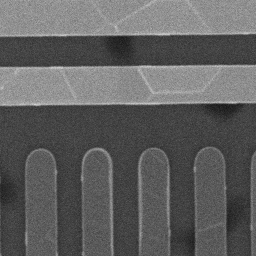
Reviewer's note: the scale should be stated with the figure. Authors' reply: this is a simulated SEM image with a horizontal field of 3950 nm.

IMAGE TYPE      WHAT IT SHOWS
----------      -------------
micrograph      groups of lines, slits or small figures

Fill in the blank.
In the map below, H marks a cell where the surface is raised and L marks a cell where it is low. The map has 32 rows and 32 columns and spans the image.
HHHHHHHHHHHHHHHHHHHHHHHHHHHHHHHH
HHHHHHHHHHHHHHHHHHHHHHHHHHHHHHHH
HHHHHHHHHHHHHHHHHHHHHHHHHHHHHHHH
HHHHHHHHHHHHHHHHHHHHHHHHHHHHHHHH
HLLLLLLLLLLLLLLLLLLLLLLLLLLLLLLL
LLLLLLLLLLLLLLLLLLLLLLLLLLLLLLLL
LLLLLLLLLLLLLLLLLLLLLLLLLLLLLLLL
LLLLLLLLLLLLLLLLLLLLLLLLLLLLLLLL
HHHHHHHHHHHHHHHHHHHHHHHHHHHHHHHH
HHHHHHHHHHHHHHHHHHHHHHHHHHHHHHHH
HHHHHHHHHHHHHHHHHHHHHHHHHHHHHHHH
HHHHHHHHHHHHHHHHHHHHHHHHHHHHHHHH
HHHHHHHHHHHHHHHHHHHHHHHHHHHHHHHH
LLLLLLLLLLLLLLLLLLLLLLLLLLLLLLLL
LLLLLLLLLLLLLLLLLLLLLLLLLLLLLLLL
LLLLLLLLLLLLLLLLLLLLLLLLLLLLLLLL
LLLLLLLLLLLLLLLLLLLLLLLLLLLLLLLL
LLLLLLLLLLLLLLLLLLLLLLLLLLLLLLLL
LLLLLLLLLLLLLLLLLLLLLLLLLLHLLLLL
LLLLHHLLLLLHHLLLLLHHHLLLLHHHLLLL
LLLHHHHLLLHHHHLLLLHHHLLLHHHHLLLH
LLLHHHHLLLHHHHLLLLHHHLLLHHHHLLLH
LLLHHHHLLLHHHHLLLLHHHLLLHHHHLLLH
LLLHHHHLLLHHHHLLLLHHHLLLLHHHLLLH
LLLHHHHLLLHHHHLLLLHHHLLLLHHHLLLH
LLLHHHHLLLHHHHLLLLHHHLLLLHHHLLLH
LLLHHHHLLLHHHHLLLLHHHLLLLHHHLLLH
LLLHHHHLLLHHHHLLLLHHHLLLLHHHLLLH
LLLHHHHLLLHHHHLLLLHHHLLLLHHHLLLH
LLLHHHHLLLHHHHLLLLHHHLLLLHHHLLLH
LLLHHHHLLLHHHHLLLLHHHLLLLHHHLLLH
LLLHHHHLLLHHHHLLLLHHHLLLLHHHLLLL